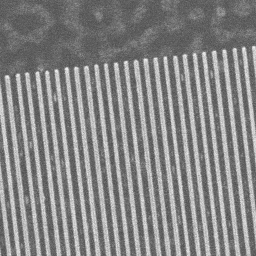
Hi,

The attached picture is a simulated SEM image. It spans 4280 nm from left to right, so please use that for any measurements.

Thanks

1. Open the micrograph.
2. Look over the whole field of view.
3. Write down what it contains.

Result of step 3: parallel lines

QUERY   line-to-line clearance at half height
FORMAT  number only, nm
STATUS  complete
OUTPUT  106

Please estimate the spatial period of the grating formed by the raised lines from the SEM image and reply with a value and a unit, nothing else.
166 nanometers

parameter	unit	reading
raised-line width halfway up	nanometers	60.2